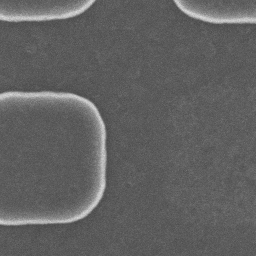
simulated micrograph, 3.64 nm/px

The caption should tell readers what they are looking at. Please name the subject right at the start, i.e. raised bodies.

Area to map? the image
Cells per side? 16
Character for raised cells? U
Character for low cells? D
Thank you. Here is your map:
UUUUUDDDDDDUUUUU
DDDDDDDDDDDDDDDD
DDDDDDDDDDDDDDDD
DDDDDDDDDDDDDDDD
DDDDDDDDDDDDDDDD
DDDDDDDDDDDDDDDD
UUUUUUDDDDDDDDDD
UUUUUUDDDDDDDDDD
UUUUUUDDDDDDDDDD
UUUUUUDDDDDDDDDD
UUUUUUDDDDDDDDDD
UUUUUUDDDDDDDDDD
UUUUUUDDDDDDDDDD
UUUUUDDDDDDDDDDD
DDDDDDDDDDDDDDDD
DDDDDDDDDDDDDDDD